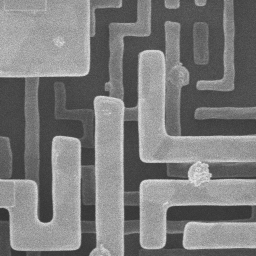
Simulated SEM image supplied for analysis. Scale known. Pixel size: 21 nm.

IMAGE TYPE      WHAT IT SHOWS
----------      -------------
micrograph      wiring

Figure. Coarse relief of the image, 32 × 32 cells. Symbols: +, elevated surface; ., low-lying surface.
+++++++++++.....................
+++++++++++.....................
+++++++++++.....................
+++++++++++.....................
+++++++++++.....................
+++++++++++.....................
+++++++++++.......++............
+++++++++++......++++...........
+++++++++++......++++...........
++++++++++.......++++...........
.................++++...........
.................++++...........
............+++..++++...........
............++++.++++...........
............+++..+++............
............+++..++++...........
............+++..++++...........
.......+++..+++..+++++++++++++++
.......+++..+++..+++++++++++++++
.......+++..+++...++++++++++++++
.......+++..+++.........++......
.......+++..+++.........++......
+......+++..+++........+++++++++
+++++..+++..+++...++++++++++++++
+++++..+++..+++...++++++++++++++
+++++..+++..+++...++++++++++++++
.++++..+++..+++...+++...........
.++++.++++..+++...+++...........
.+++++++++..+++...+++..+++++++++
.+++++++++..+++...+++..+++++++++
.+++++++++..+++...+++..+++++++++
...........++++.................